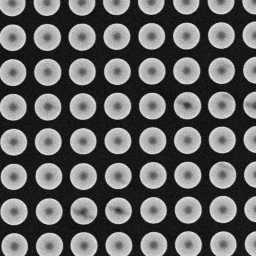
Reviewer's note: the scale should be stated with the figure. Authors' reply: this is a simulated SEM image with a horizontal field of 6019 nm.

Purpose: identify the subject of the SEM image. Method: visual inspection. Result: an array of small figures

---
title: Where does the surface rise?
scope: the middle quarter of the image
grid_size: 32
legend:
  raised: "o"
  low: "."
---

..ooooo....ooooo...oooooo...oooo
.ooooooo..ooooooo..oooooo..ooooo
.ooooooo..ooooooo..oooooo..ooooo
..oooooo...ooooo...oooooo...oooo
..ooooo....oooo.....oooo.....ooo
................................
................................
............ooo......oo.......oo
..ooooo....ooooo....ooooo...oooo
..oooooo..oooooo...oooooo...oooo
..oooooo..ooooooo..oooooo...oooo
..oooooo..ooooooo..oooooo...oooo
..ooooo....ooooo...oooooo...oooo
...ooo......ooo......oo......ooo
................................
................................
...ooo......ooo.....oooo.....ooo
..ooooo....ooooo...oooooo...oooo
..oooooo..ooooooo..oooooo...oooo
..oooooo..ooooooo..oooooo...oooo
..oooooo..oooooo...oooooo...oooo
..ooooo....ooooo....oooo.....ooo
................................
................................
................................
...oooo.....ooo.....ooooo....ooo
..oooooo...oooooo..oooooo...oooo
..oooooo..ooooooo..oooooo...oooo
..oooooo..ooooooo..oooooo...oooo
..oooooo...ooooo...oooooo...oooo
..ooooo.....oooo....oooo.....ooo
................................